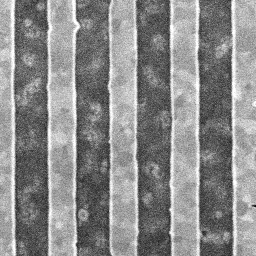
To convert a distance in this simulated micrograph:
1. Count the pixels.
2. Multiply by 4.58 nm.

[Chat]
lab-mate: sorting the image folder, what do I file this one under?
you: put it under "parallel lines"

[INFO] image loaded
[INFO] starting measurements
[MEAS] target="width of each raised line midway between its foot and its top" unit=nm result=118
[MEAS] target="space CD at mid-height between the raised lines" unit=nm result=166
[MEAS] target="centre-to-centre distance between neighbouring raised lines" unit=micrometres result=0.281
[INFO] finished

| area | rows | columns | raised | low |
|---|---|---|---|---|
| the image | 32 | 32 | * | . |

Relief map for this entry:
**....***.....***....****....***
**....***.....***.....***....***
**....***.....***....****....***
**....****....***....****....***
**....***.....***....****....***
**....***.....***....****....***
**....***.....***....****....***
**....***.....***....****....***
**....***.....***....****....***
*.....***.....***....****....***
**....***.....***....****....***
**....***.....***....****....***
**....***.....***.....***....***
**....***.....***.....***....***
**....***.....***.....***....***
**....***.....***.....***....***
**....***.....***.....***....***
**....***.....***.....***....***
**....***.....***.....***....***
**....***.....***.....***....***
**....***.....***.....***....***
**....***.....***.....***....***
**....***.....***....****....***
**....***.....***....****....***
**....***.....***.....***....***
**....***.....***.....***....***
**....***.....***....****....***
**....***.....***.....***....***
**....***.....***....****....***
**....***.....***....****....***
**....***.....***.....***....***
**....***.....***.....***....***